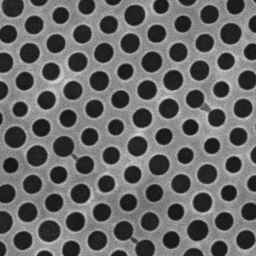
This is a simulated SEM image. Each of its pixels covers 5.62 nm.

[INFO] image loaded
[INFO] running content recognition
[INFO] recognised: a regular array of holes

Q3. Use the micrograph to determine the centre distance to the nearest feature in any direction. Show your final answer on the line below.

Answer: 157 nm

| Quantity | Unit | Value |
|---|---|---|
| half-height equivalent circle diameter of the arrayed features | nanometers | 107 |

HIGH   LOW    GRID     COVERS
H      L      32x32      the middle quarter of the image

HLLLLLHHHHHHHHLLLHHLLLLLHHHHHHHH
HHLLLHHHHHHHHLLLLHHHLLLLHHHLHHHL
HHHHHHHLLLLHHLLLLHHHHHHHHLLLLHHH
HHHHHHLLLLLHHHLLHHHHHHHHHLLLLLHH
HLLHHHLLLLLHHHHHHHHLLLHHHLLLLLHH
LLLLHHHLLLLHHHHHHHLLLLLHHLLLLHHH
LLLLLHHHLLHHHHHHHHLLLLLHHHLLHHHH
LLLLHHHHHHHHLLLLHHLLLLLHHHHHHHHL
HLLLHHHHHHHHLLLLHHHLLLHHHHHHHHLL
HHHHHHLLLHHHLLLLHHHHHHHHLLLLHHLL
HHHHHLLLLLHHLLLLHHHHHHHHLLLLLHHL
LLHHHLLLLLHHHHHHHHLLLHHHLLLLLHHH
LLLHHHLLLHHHHHHHHLLLLLHHLLLLHHHH
LLLHHHHLHHHHHHHHHLLLLLHHHLLHHHHH
LLLHHHHHHHHLLLLHHLLLLLHHHHHHHHLL
LLHHHHHHHHHLLLLHHHLLLHHHHHHHHLLL
HHHHHLLLHHHLLLLHHHHHHHHHLLLHHHLL
HHHHLLLLHHHHLLHHHHHHHHHLLLLHHHLL
LLHHLLLLLHHHHHHHHLLLHHHLLLLHHHHH
LLHHHLLLHHHHHHHHLLLLLHHLLLLHHHHH
LLLHHHHHHHHHHHHHLLLLLHHHHHHHHHHH
LLHHHHHHHHLLLLHHLLLLLHHHHHHHHLLL
LLLHHHHHHHLLLLHHHLLLHHHHHHHHLLLL
HHLLLLLHHHLLLLHHHHHHHHLLLLHHLLLL
HHHLLLLLHHLLLHHHHHHHHLLLLLHHHLLL
HHHLLLLLHHHHHHHHLLHHHLLLLLHHHHHH
LHHLLLLHHHHHHHHLLLLHHLLLLLHHHHHH
LHHHHLHHHHHHHHHLLLLHHHLLLHHHHLHH
LHHHHHHHHLLLHHHLLLLHHHHHHHHLLLLH
HHHHHHHHLLLLLHHHLLLHHHHHHHHLLLLL
HHHLLLHHHLLLLHHHHHHHHLLLHHHLLLLL
HHLLLLHHHLLLHHHHHHHHLLLLLHHLLLLH